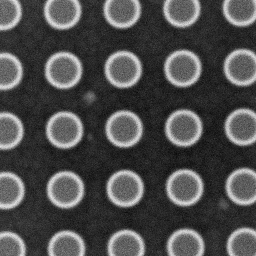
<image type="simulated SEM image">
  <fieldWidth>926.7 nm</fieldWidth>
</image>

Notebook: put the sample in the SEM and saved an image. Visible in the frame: an array of small figures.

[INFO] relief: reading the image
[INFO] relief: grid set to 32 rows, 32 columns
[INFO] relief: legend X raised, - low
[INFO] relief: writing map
XX----XXXX---XXXX----XXXX---XXXX
XX----XXXX---XXXX----XXXX---XXXX
XX----XXXX----XXX----XXX-----XXX
X-------------------------------
--------------------------------
--------------------------------
----------------------XX-----XX-
XX----XXXX----XXX----XXXX---XXXX
XXX---XXXX---XXXX----XXXX---XXXX
XXX---XXXX---XXXX----XXXX---XXXX
XX-----XX-----XXX-----XX------X-
--------------------------------
--------------------------------
--------------------------------
XX-----XX-----XXX----XXX-----XXX
XXX---XXXX---XXXXX---XXXX---XXXX
XXX---XXXX---XXXXX---XXXX---XXXX
XX----XXXX----XXX----XXXX----XXX
--------------------------------
--------------------------------
--------------------------------
---------------X------XX-----XXX
XX----XXXX----XXX----XXXX----XXX
XXX---XXXX----XXXX---XXXX---XXXX
XXX---XXXX----XXXX---XXXX----XXX
XX-----XX------XX-----XX--------
--------------------------------
--------------------------------
--------------------------------
XX-----XXX----XXX-----XXX----XXX
XXX---XXXX----XXXX---XXXX---XXXX
XXX---XXXX----XXXX---XXXX----XXX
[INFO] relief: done